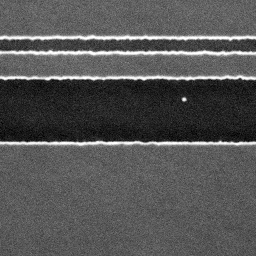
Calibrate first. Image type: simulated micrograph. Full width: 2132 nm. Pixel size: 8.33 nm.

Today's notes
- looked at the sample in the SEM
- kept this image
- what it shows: lines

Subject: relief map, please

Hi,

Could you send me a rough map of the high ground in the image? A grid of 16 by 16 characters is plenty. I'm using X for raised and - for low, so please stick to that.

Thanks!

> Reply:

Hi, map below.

XXXXXXXXXXXXXXXX
XXXXXXXXXXXXXXXX
XXXXXXXXXXXXXXXX
XXXXXXXXXXXXXXXX
XXXXXXXXXXXXXXXX
----------------
----------------
----------------
----------------
XXXXXXXXXXXXXXXX
XXXXXXXXXXXXXXXX
XXXXXXXXXXXXXXXX
XXXXXXXXXXXXXXXX
XXXXXXXXXXXXXXXX
XXXXXXXXXXXXXXXX
XXXXXXXXXXXXXXXX